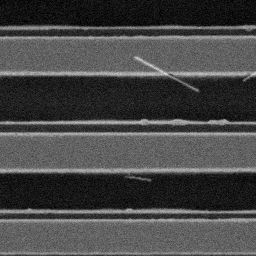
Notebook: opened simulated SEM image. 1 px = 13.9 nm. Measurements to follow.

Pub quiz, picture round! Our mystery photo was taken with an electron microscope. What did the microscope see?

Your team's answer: lines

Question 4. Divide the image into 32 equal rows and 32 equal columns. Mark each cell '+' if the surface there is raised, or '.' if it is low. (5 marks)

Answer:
................................
................................
................................
................................
................................
++++++++++++++++++++++++++++++++
++++++++++++++++++++++++++++++++
++++++++++++++++++++++++++++++++
++++++++++++++++++++++++++++++++
................................
................................
................................
................................
................................
................................
......................+....+....
................................
++++++++++++++++++++++++++++++++
++++++++++++++++++++++++++++++++
++++++++++++++++++++++++++++++++
++++++++++++++++++++++++++++++++
................................
................................
................................
................................
................................
...+............................
++++++++++++++++++++++++++++++++
++++++++++++++++++++++++++++++++
++++++++++++++++++++++++++++++++
++++++++++++++++++++++++++++++++
++++++++++++++++++++++++++++++++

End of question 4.